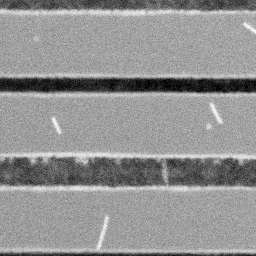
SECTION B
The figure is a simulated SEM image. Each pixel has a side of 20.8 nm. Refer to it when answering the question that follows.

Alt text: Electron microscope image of lines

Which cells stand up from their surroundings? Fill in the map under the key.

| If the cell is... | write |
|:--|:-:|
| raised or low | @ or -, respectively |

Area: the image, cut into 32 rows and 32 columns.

--------------------------------
@@@@@@@@@@@@@@@@@@@@@@@@@@@@@@@@
@@@@@@@@@@@@@@@@@@@@@@@@@@@@@@@@
@@@@@@@@@@@@@@@@@@@@@@@@@@@@@@@@
@@@@@@@@@@@@@@@@@@@@@@@@@@@@@@@@
@@@@@@@@@@@@@@@@@@@@@@@@@@@@@@@@
@@@@@@@@@@@@@@@@@@@@@@@@@@@@@@@@
@@@@@@@@@@@@@@@@@@@@@@@@@@@@@@@@
@@@@@@@@@@@@@@@@@@@@@@@@@@@@@@@@
@@@@@@@@@@@@@@@@@@@@@@@@@@@@@@@@
--------------------------------
--------------------------------
@@@@@@@@@@@@@@@@@@@@@@@@@@@@@@@@
@@@@@@@@@@@@@@@@@@@@@@@@@@@@@@@@
@@@@@@@@@@@@@@@@@@@@@@@@@@@@@@@@
@@@@@@@@@@@@@@@@@@@@@@@@@@@@@@@@
@@@@@@@@@@@@@@@@@@@@@@@@@@@@@@@@
@@@@@@@@@@@@@@@@@@@@@@@@@@@@@@@@
@@@@@@@@@@@@@@@@@@@@@@@@@@@@@@@@
--------------@@@@@@@@@@@@@@@@@@
--------------------------------
--------------------------------
--------------------------------
@@@@@@@@@@@@@@@@@@@@@@@@@@@@@@@@
@@@@@@@@@@@@@@@@@@@@@@@@@@@@@@@@
@@@@@@@@@@@@@@@@@@@@@@@@@@@@@@@@
@@@@@@@@@@@@@@@@@@@@@@@@@@@@@@@@
@@@@@@@@@@@@@@@@@@@@@@@@@@@@@@@@
@@@@@@@@@@@@@@@@@@@@@@@@@@@@@@@@
@@@@@@@@@@@@@@@@@@@@@@@@@@@@@@@@
@@@@@@@@@@@@@@@@@@@@@@@@@@@@@@@@
----------------------@@@@@@@@@@